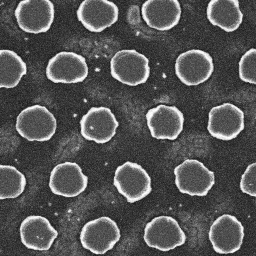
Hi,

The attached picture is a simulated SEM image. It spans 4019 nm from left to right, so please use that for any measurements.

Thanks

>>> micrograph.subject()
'a regular array of raised bodies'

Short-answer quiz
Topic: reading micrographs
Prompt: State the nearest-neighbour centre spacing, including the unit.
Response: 62 pixels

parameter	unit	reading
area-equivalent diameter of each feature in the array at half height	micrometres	0.559